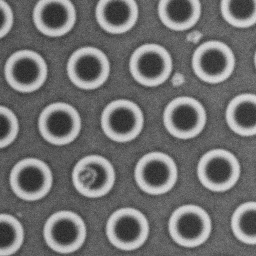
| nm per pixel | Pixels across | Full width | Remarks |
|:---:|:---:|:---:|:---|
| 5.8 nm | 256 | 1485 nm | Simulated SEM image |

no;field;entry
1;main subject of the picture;an array of small figures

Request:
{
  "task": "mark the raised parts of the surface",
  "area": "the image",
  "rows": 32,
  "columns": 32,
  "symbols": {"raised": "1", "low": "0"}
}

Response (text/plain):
10000111100011111000111110001111
10001111100011111000111110001111
11001111100011111000111110001111
10000111100001110000011100000000
00000000000000000000000000000000
00000000000000000000000001110000
00110000011110000111100011111000
01111000011110001111100011111000
01111100111111001111100011111000
01111100011110000111100001111000
01111000011110000011000000000000
00000000000000000000000000000000
00000000000000000000001100000111
10000011100001111000011110001111
11000111110001111100011111001111
11000111110001111100011111000111
11000111110001111000011110000111
11000011100000110000000000000000
00000000000000000000000000000000
00000000000100000011100001111000
00111100001111000111110001111100
01111100011111000111110001111100
01111100011111000111110001111100
00111100001111000011100000111000
00111000000110000000000000000000
00000000000000000000000000000001
00000001100000111000001111000111
11000011110000111100011111000111
11100011111001111110011111000111
11100011111001111100011111000011
11100011110000111100001110000000
11000001100000000000000000000000